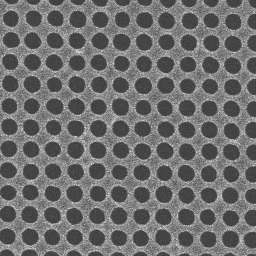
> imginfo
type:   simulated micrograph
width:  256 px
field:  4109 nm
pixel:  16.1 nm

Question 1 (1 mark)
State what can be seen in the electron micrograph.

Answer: a regular array of holes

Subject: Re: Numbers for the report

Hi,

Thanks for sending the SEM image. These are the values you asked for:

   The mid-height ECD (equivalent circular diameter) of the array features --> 265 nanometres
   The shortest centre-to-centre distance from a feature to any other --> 344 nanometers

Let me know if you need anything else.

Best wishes